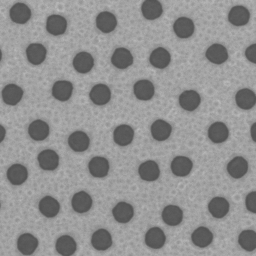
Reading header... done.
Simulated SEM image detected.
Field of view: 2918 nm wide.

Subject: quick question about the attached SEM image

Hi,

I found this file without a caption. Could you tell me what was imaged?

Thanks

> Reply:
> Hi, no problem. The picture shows a regular array of holes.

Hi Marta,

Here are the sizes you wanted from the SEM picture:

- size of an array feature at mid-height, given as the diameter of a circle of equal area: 0.246 micrometres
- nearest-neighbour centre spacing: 402 nanometres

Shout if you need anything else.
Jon